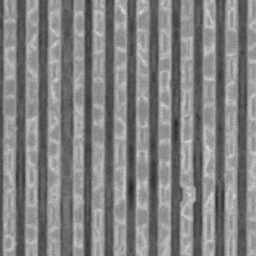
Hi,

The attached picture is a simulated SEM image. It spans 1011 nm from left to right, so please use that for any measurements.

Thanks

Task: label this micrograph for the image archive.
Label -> parallel lines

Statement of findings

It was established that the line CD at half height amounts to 0.0499 um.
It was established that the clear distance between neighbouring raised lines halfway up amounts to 39 nm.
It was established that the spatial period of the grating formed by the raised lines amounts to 87.6 nm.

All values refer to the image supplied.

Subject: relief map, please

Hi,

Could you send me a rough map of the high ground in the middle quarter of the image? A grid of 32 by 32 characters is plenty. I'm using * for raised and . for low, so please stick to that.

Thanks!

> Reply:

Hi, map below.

...**..***...***..***...***..***
..***..***...***..***...***..***
...**..***...***..***...***..***
...**..***...***..***...***..***
..***..***...***..***...***..***
..***..***...***..***...***..***
..***..***...***..***...***..***
...**..***...***..***...***..***
..***..***...***..***...***..***
..***..***...**...***...***..***
...**..***...**...***...***..***
...**..***...**...***...***..***
...**..***...**...***...***..***
...**..***...**...***...***..***
...**..***...**...***...***..***
...**..***...**...***...***..***
...**..***...**...***...***..***
...**..***...**...***...***..***
...**..***...**...***...***..***
..***..***...**...***...***..***
..***..***...**...***...***..***
..***..***...**...***...***..***
..***..***...**...***...***..***
..***..***...**...***...***..***
...**..***...**...***...***..***
..***..***...***..***...***..***
..***..***...**...***...***..***
...**..***...**...***...***..***
...**..***...**...***...***..***
...**..***...**...***...***..***
...**..***...**...***...***..***
..***..***...**...***...***...**